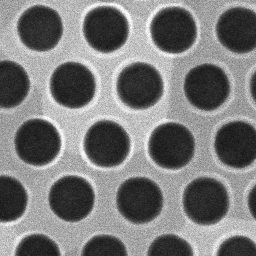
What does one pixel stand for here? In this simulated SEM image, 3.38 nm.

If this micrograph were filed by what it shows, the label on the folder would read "a regular array of holes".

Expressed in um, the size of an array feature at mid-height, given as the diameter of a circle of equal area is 0.148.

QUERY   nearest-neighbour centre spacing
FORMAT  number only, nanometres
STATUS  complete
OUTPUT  220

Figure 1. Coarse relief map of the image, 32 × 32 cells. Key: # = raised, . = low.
################################
###....####....#####...#####...#
##......###.....###.....####....
##......##......###.....###.....
###.....###.....###.....###.....
###....####....#####....####....
#####################.##########
################################
...####....#####...######..#####
...####.....###.....###.....####
....##......###.....###.....###.
...####.....###.....###......##.
...####....####.....####....####
#########################..#####
################################
###...######...######.#######..#
##.....####.....###.....###.....
##.....####.....###.....###.....
##.....####.....###.....###.....
##.....####.....###.....###.....
####.#######...#####...#####...#
################################
..######..######..#######..#####
...####....####.....####....####
...###......###.....###.....###.
...###......###.....###.....###.
...####....####.....###.....###.
.#######..######...#####...#####
################################
####..##########################
###....####....####....#####....
##.....###......###.....###.....